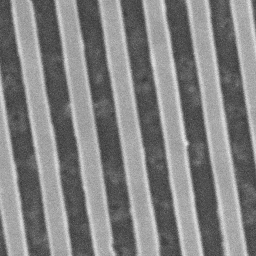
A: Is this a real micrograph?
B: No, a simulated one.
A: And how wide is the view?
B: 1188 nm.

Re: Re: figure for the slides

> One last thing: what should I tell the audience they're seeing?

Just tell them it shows parallel lines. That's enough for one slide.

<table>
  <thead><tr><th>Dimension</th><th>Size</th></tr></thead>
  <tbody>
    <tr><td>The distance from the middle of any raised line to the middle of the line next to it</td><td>200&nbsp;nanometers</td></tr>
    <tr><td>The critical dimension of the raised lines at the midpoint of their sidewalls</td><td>0.0865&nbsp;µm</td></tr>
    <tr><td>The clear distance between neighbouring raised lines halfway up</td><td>116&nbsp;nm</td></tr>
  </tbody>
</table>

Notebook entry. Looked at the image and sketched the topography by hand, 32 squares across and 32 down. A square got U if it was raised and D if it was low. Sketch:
DDUUDDDUUDDDDUUDDDUUDDDDUUDDDUUD
DDUUDDDUUUDDDUUDDDUUUDDDUUDDDUUD
DDUUDDDDUUDDDUUDDDUUUDDDUUDDDUUD
DDUUDDDDUUDDDUUDDDDUUDDDUUDDDUUU
DDUUUDDDUUDDDUUDDDDUUDDDUUDDDDUU
DDUUUDDDUUDDDUUUDDDUUDDDUUUDDDUU
DDDUUDDDUUDDDUUUDDDUUDDDUUUDDDUU
DDDUUDDDUUUDDDUUDDDUUDDDDUUDDDUU
DDDUUDDDUUUDDDUUDDDUUUDDDUUDDDUU
DDDUUDDDDUUDDDUUDDDUUUDDDUUDDDUU
DDDUUDDDDUUDDDUUDDDDUUDDDUUDDDDU
DDDUUUDDDUUDDDUUUDDDUUDDDUUDDDDU
DDDUUUDDDUUDDDDUUDDDUUDDDUUUDDDU
DDDDUUDDDUUDDDDUUDDDUUDDDDUUDDDU
UDDDUUDDDUUUDDDUUDDDUUUDDDUUDDDU
UDDDUUDDDUUUDDDUUDDDUUUDDDUUDDDU
UDDDUUUDDUUUDDDUUDDDDUUDDDUUDDDD
UDDDUUUDDDUUDDDUUUDDDUUDDDUUDDDD
UDDDDUUDDDUUDDDUUUDDDUUDDDUUUDDD
UDDDDUUDDDUUDDDUUUDDDUUDDDUUUDDD
UUDDDUUDDDUUUDDDUUDDDUUDDDDUUDDD
UUDDDUUDDDUUUDDDUUDDDUUUDDDUUDDD
UUDDDUUDDDUUUDDDUUDDDUUUDDDUUDDD
UUDDDUUUDDDUUDDDUUDDDDUUDDDUUDDD
UUDDDUUUDDDUUDDDUUUDDDUUDDDUUUDD
UUDDDDUUDDDUUDDDUUUDDDUUDDDUUUDD
UUUDDDUUDDDUUDDDDUUDDDUUDDDDUUDD
UUUDDDUUDDDUUUDDDUUDDDUUDDDDUUDD
DUUDDDUUDDDUUUDDDUUDDDUUUDDDUUDD
DUUDDDUUDDDDUUDDDUUUDDDUUDDDUUDD
DUUDDDUUUDDDUUDDDUUUDDDUUDDDUUUD
DUUDDDUUUDDDUUDDDUUUDDDUUDDDUUUD